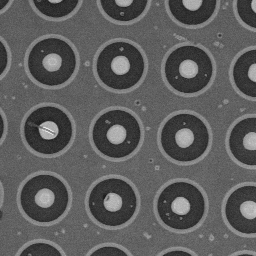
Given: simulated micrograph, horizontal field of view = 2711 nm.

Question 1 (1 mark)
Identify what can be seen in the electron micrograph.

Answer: an array of small figures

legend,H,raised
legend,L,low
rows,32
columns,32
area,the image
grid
LHHHLLLLLLHHLLLHLLLHHLLHHLLHHLLL
HHHHHLLLLHHHHLLLLLHHHLLLLLLHHHLL
HHHHHHHHHHHHHHLLLHHHHHLLLLHHHHLL
HHHHHHHHHHHHHHHHHHHHHHHHHHHHHHHL
HHHHHHHHHHHHHHHHHHHHHHHHHHHHHHHH
LHHHLLLLLHHHHLLLLHHHHHHLHHHHHHHH
LHHHLLLLLHHHLLLLLLHHHLLLLLHHHHLL
LHHLLLHLLLHHLLLLLLHHHLLLLLLHHLLL
LHHLLLLLLLHHLLHHLLHHLLLHLLLHHLLL
HHHHLLLLLHHHLLLLLLHHLLLLLLLHHLLH
HHHHHLLLHHHHHLLLLHHHHLLLLLHHHLLL
HHHHHHHHHHHHHHHHHHHHHHLLLHHHHHLL
HHHHHHHHHHHHHHHHHHHHHHHHHHHHHHHH
HHHHLLLLHHHHHHHHHHHHHHHHHHHHHHHH
HHHLLLLLLHHHLLLLLHHHHLLLLHHHHHHH
LHHLLHHLLHHHLLLLLLHHLLLLLLHHHLLL
LHHLLHHLLHHLLLHLLLHHLLLLLLHHHLLL
HHHLLLLLLHHLLLHLLLHHLLLHLLHHLLLH
HHHHLLLLHHHHLLLLLHHHLLLLLLHHLLLL
HHHHHHHHHHHHHLLLHHHHHLLLLHHHHLLL
HHHHHHHHHHHHHHHHHHHHHHHHHHHHHHLL
HHHHHHHHHHHHHHHHHHHHHHHHHHHHHHHH
HHHLLLLLHHHHHLLLHHHHHHHHHHHHHHHH
HHHLLLLLHHHLLLLLLHHHLLLLLHHHHLLL
HHLLLHLLLHHLLLLLLHHHLLLLLLHHLLLL
HHLLLLLLLHHLLHHLLHHLLLHLLLHHLLLL
HHHLLLLLHHHLLLLLLHHHLLHLLLHHLLLH
HHHHLLLHHHHHLLLLHHHHLLLLLHHHLLLL
HHHHHHHHHHHHHHHHHHHHHLLLHHHHHLLL
HHHHHHHHHHHHHHHHHHHHHHHHHHHHHHHH
HHHHLLHHHHHHHHHHHHHHHHHHHHHHHHHH
HHHLLLLLHHHLLLLLHHHHHLLLHHHHHHHH